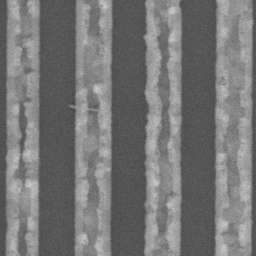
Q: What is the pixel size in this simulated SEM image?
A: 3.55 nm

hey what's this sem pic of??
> one or a few lines or trenches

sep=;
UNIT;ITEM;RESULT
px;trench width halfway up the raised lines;43.1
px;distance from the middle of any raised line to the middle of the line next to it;70.4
